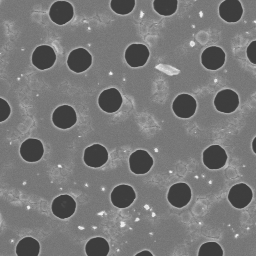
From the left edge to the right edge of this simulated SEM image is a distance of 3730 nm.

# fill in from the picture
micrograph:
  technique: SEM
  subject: a regular array of holes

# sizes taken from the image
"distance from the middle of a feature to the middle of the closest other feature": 673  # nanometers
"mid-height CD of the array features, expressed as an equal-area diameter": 0.347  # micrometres